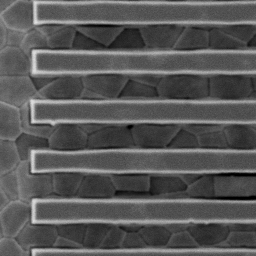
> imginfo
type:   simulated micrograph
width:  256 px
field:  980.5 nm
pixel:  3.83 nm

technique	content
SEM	parallel lines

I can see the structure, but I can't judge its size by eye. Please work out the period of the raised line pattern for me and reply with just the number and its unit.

190 nm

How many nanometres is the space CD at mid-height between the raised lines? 107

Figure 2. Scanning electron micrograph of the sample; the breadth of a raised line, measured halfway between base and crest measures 83.8 nm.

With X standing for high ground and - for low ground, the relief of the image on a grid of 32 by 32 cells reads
----XXXXXXXXXXXXXXXXXXXXXXXXXXXX
----XXXXXXXXXXXXXXXXXXXXXXXXXXXX
----XXXXXXXXXXXXXXXXXXXXXXXXXXXX
--------------------------------
--------------------------------
--------------------------------
----XXXXXXXXX--------XXXXXXXXXXX
----XXXXXXXXXXXXXXXXXXXXXXXXXXXX
----XXXXXXXXXXXXXXXXXXXXXXXXXXXX
--------------------------------
--------------------------------
--------------------------------
--------------------------------
----XXXXXXXXXXXXXXXXXXXXXXXXXXXX
----XXXXXXXXXXXXXXXXXXXXXXXXXXXX
--------------------------------
--------------------------------
--------------------------------
--------------------------------
----XXXXXXXXXXXXXXXXXXXXXXXXXXXX
----XXXXXXXXXXXXXXXXXXXXXXXXXXXX
-------------XXXXXXXXXXXXXXXXXXX
----------------------------XXXX
----------------------------XXXX
----------------------------XXXX
----XXXXXXXXXXXXXXXXXXXXXXXXXXXX
----XXXXXXXXXXXXXXXXXXXXXXXXXXXX
----XXXXXXXXXXXXXXXXXXXXXXXXXXXX
--------------------------------
--------------------------------
--------------------------------
----XXXXXXXXXXXXXXXXXXXXXXXXXXXX